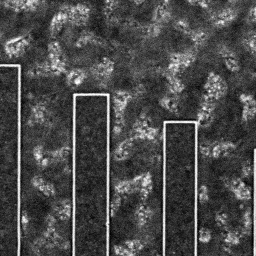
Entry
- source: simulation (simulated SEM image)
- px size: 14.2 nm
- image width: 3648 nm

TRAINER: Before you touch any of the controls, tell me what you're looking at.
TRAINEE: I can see one or a few lines or trenches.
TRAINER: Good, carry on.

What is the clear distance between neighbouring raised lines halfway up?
800 nm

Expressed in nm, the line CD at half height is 483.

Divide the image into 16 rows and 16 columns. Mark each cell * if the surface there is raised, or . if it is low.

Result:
................
................
................
................
*...............
*...............
*....**.........
*....**.........
*....**...**....
*....**...**....
*....**...**....
*....**...**....
*....**...**....
*....**...**....
*....**...**....
*....**...**....